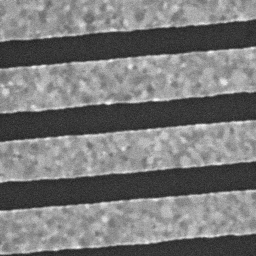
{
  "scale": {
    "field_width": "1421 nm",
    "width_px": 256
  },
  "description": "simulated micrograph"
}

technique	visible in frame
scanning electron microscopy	lines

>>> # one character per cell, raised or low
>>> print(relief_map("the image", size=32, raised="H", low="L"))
HHHHHHHHHHHHHHHHHHHHHHHHHHHHHHHH
HHHHHHHHHHHHHHHHHHHHHHHHHHHHHHHH
HHHHHHHHHHHHHHHHHHHHHHHHHHHHHHHL
HHHHHHHHHHHHHHHHHHHLLLLLLLLLLLLL
HHHHHHHHLLLLLLLLLLLLLLLLLLLLLLLL
LLLLLLLLLLLLLLLLLLLLLLLLLLLLLLLL
LLLLLLLLLLLLLLLLLLLLLLLLLLHHHHHH
LLLLLLLLLLLLLHHHHHHHHHHHHHHHHHHH
LLHHHHHHHHHHHHHHHHHHHHHHHHHHHHHH
HHHHHHHHHHHHHHHHHHHHHHHHHHHHHHHH
HHHHHHHHHHHHHHHHHHHHHHHHHHHHHHHH
HHHHHHHHHHHHHHHHHHHHHHHHHHHHHHLL
HHHHHHHHHHHHHHHHHHHHHLLLLLLLLLLL
HHHHHHHHLLLLLLLLLLLLLLLLLLLLLLLL
LLLLLLLLLLLLLLLLLLLLLLLLLLLLLLLL
LLLLLLLLLLLLLLLLLLLLLLLLLLHHHHHH
LLLLLLLLLLLLLLLHHHHHHHHHHHHHHHHH
LLLHHHHHHHHHHHHHHHHHHHHHHHHHHHHH
HHHHHHHHHHHHHHHHHHHHHHHHHHHHHHHH
HHHHHHHHHHHHHHHHHHHHHHHHHHHHHHHH
HHHHHHHHHHHHHHHHHHHHHHHHHHHHLLLL
HHHHHHHHHHHHHHHHLLLLLLLLLLLLLLLL
HHHHLLLLLLLLLLLLLLLLLLLLLLLLLLLL
LLLLLLLLLLLLLLLLLLLLLLLLLLLLLLLL
LLLLLLLLLLLLLLLLLLLLLLLHHHHHHHHH
LLLLLLLLLLLHHHHHHHHHHHHHHHHHHHHH
HHHHHHHHHHHHHHHHHHHHHHHHHHHHHHHH
HHHHHHHHHHHHHHHHHHHHHHHHHHHHHHHH
HHHHHHHHHHHHHHHHHHHHHHHHHHHHHHHH
HHHHHHHHHHHHHHHHHHHHHHHHHHHLLLLL
HHHHHHHHHHHHHHHHHLLLLLLLLLLLLLLL
HHHHLLLLLLLLLLLLLLLLLLLLLLLLLLLL